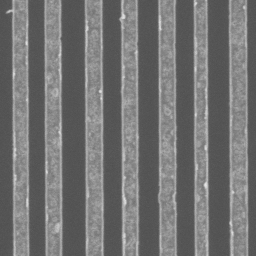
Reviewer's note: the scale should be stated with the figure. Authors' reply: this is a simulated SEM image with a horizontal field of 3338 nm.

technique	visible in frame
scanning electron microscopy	parallel lines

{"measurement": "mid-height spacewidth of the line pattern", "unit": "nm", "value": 280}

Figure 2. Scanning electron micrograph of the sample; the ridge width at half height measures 0.204 um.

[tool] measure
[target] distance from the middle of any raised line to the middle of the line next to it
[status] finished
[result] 0.474 micrometres